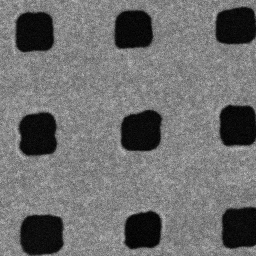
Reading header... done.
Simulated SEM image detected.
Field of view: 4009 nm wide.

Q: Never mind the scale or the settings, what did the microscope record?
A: holes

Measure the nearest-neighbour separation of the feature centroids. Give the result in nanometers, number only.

1550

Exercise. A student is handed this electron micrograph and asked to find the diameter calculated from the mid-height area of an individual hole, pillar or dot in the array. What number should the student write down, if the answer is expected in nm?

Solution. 653